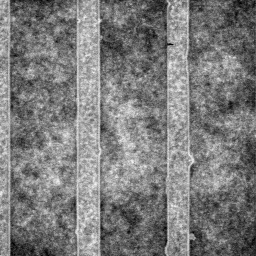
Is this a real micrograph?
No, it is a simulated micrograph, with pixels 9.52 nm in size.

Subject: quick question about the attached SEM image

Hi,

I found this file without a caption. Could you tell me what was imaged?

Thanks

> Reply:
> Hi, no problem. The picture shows one or a few lines or trenches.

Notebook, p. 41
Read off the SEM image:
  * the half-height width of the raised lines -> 201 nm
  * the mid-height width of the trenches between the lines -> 651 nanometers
